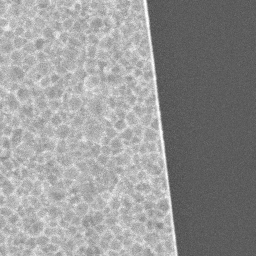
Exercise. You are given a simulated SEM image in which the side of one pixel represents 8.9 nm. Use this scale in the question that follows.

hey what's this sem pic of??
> one or a few lines or trenches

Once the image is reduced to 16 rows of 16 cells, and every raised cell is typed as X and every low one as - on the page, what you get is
XXXXXXXXX-------
XXXXXXXXX-------
XXXXXXXXX-------
XXXXXXXXX-------
XXXXXXXXXX------
XXXXXXXXXX------
XXXXXXXXXX------
XXXXXXXXXX------
XXXXXXXXXX------
XXXXXXXXXX------
XXXXXXXXXX------
XXXXXXXXXXX-----
XXXXXXXXXXX-----
XXXXXXXXXXX-----
XXXXXXXXXXX-----
XXXXXXXXXXX-----